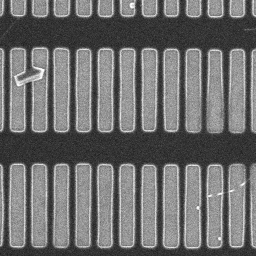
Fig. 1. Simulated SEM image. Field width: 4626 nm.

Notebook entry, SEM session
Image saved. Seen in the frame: groups of lines, slits or small figures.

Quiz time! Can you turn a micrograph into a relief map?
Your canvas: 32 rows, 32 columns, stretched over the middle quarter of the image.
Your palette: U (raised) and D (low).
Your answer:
DUUDDDDUUDDDUUDDDDUUDDDUUDDDDUUD
DUUDDDDUUDDDUUDDDDUUDDDUUDDDDUUD
DUUDDDDUUDDDUUDDDDUUDDDUUDDDDUUD
DUUDDDDUUDDDUUDDDDUUDDDUUDDDDUUD
DUUDDDDUUDDDUUDDDDUUDDDUUDDDDUUD
DUUDDDDUUDDDUUDDDDUUDDDUUDDDDUUD
DUUDDDDUUDDDUUDDDDUUDDDUUDDDDUUD
DUUDDDDUUDDDUUDDDDUUDDDUUDDDDUUD
DUUDDDDUUDDDUUDDDDUUDDDUUDDDDUUD
DUUDDDDUUDDDUUDDDDUUDDDUUDDDDUUD
DUUDDDDUUDDDUUDDDDUUDDDUUDDDDUUD
DUUDDDDUUDDDUUDDDDUUDDDUUDDDDUUD
DUUDDDDUUDDDUUDDDDUUDDDUUDDDDUUD
DUUDDDDUUDDDUUDDDDUUDDDUUDDDDUUD
DUUDDDDUUDDDUUDDDDUUDDDUUDDDDUUD
DUUDDDDUUDDDUUDDDDUUDDDUUDDDUUUD
DUUDDDUUUDDDUUDDDUUUDDUUUUDDUUUD
UUUUUUUUUUUUUUUUUUUUUUUUUUUUUUUU
UUUUUUUUUUUUUUUUUUUUUUUUUUUUUUUU
UUUUUUUUUUUUUUUUUUUUUUUUUUUUUUUU
UUUUUUUUUUUUUUUUUUUUUUUUUUUUUUUU
UUUUUUUUUUUUUUUUUUUUUUUUUUUUUUUU
UUUUUUUUUUUUUUUUUUUUUUUUUUUUUUUU
UUUUUUUUUUUUUUUUUUUUUUUUUUUUUUUU
UUUUUUUUUUUUUUUUUUUUUUUUUUUUUUUU
DUUDDDUUUDDDUUUDDUUUDDUUUUDDUUUD
DUUDDDDUDDDDUUDDDDUUDDDUUDDDUUUD
DUUDDDDUDDDDUUDDDDUUDDDUUDDDDUUD
DUUDDDDUDDDDUUDDDDUUDDDUUDDDDUUD
DUUDDDDUDDDDUUDDDDUUDDDUUDDDDUUD
DUUDDDDUDDDDUUDDDDUUDDDUUDDDDUUD
DUUDDDDUDDDDUUDDDDUUDDDUUDDDDUUD